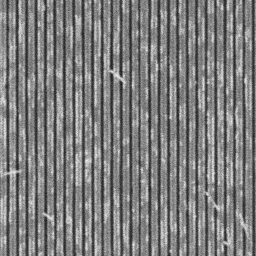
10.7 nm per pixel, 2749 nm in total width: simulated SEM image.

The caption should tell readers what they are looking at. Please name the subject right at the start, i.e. parallel lines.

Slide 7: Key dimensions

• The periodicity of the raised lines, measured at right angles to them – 0.101 micrometres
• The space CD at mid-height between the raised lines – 40.3 nm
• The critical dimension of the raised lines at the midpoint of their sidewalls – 60.4 nanometres